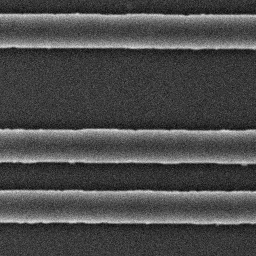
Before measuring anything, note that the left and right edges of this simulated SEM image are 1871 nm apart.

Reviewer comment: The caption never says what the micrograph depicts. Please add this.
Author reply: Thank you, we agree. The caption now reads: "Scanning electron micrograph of lines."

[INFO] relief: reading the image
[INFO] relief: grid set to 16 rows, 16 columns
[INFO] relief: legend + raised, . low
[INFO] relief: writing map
................
++++++++++++++++
++++++++++++++++
................
................
................
................
................
++++++++++++++++
++++++++++++++++
................
................
++++++++++++++++
++++++++++++++++
................
................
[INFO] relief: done